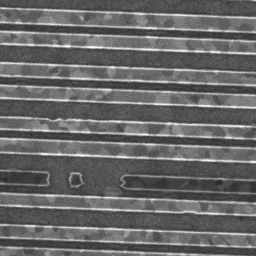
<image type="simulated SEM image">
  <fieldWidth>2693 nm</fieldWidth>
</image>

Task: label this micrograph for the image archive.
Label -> parallel lines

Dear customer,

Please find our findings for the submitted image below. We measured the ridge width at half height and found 134 nm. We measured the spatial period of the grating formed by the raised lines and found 0.284 um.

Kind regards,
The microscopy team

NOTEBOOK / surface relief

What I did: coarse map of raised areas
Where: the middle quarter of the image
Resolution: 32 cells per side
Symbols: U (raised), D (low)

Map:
UUUDDDDDDDDDDDDDDDDDDDDDDDDDDDDD
UUUUUUUUUUUUUUUUUUUUUUUUUUUUUDDD
UUUUUUUUUUUUUUUUUUUUUUUUUUUUUUUU
DDDDUUUUUUUUUUUUUUUUUUUUUUUUUUUU
DDDDDDDDDDDDDDDDDDDDDDDDDDDDDDUU
DDDDDDDDDDDDDDDDDDDDDDDDDDDDDDDD
UUUUUUUUUUUDDDDDDDDDDDDDDDDDDDDD
UUUUUUUUUUUUUUUUUUUUUUUUUUUUUUUU
UUUUUUUUUUUUUUUUUUUUUUUUUUUUUUUU
DDDDDDDDDDDDUUUUUUUUUUUUUUUUUUUU
DDDDDDDDDDDDDDDDDDDDDDDDDDDDDDDD
DDDDDDDDDDDDDDDDDDDDDDDDDDDDDDDD
DDDDDDDDDDDDDDDDDDDDDDDDDDDDDDDD
DDDDDDDDDDDDDDDDDDDDDDDDDDDDDDDD
UUUUUUUUUUUUDDDDDDDDDDDDDDDDDDDD
UUUUUUUUUUUUUUUUUUUUUUUUUUUUUUUU
UUUUUUUUUUUUUUUUUUUUUUUUUUUUUUUU
DDDDDDDDDDDDDDDDDDUUUUUUUUUUUUUU
DDDDDDDDDDDDDDDDDDDDDDDDDDDDDDDD
UUUUUDDDDDDDDDDDDDDDDDDDDDDDDDDD
UUUUUUUUUUUUUUUUUUUUUUUUUUUUUUUD
UUUUUUUUUUUUUUUUUUUUUUUUUUUUUUUU
UUUUUUUUUUUUUUUUUUUUUUUUUUUUUUUU
DDDDDDDDDDDDDDDDDDDDUUUUDDUUUUUU
DDDDDDDDDDDDDDDDDDDDDDDDDDDDDDDD
DDDDDDDDDDDDDDDDDDDDDDDDDDDDDDDD
DDDDDDDDDDDDDDDDDDDDDDDDDDDDDDDD
DDUUDDDDDDDDDDDDDDDDDDDDDDDDDDDD
DDUUDDDDDDDDDDUUUUUUUUUUUUUUUUUU
DDUUDDDDDDDDDDDUUUUUUUUUUUUUUUUU
DDUDDDDDDDDDDDDUUUUUUUUUUUUUUUUU
DDDDDDDDDDDDDDDDDDDDDDDDDDDUUUUU